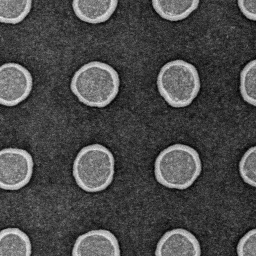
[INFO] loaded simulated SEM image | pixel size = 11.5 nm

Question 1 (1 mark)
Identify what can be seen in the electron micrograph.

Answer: raised bodies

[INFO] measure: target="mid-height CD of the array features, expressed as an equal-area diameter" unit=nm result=475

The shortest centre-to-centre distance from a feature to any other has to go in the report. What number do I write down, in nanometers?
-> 960